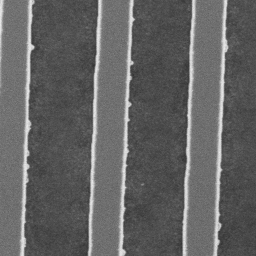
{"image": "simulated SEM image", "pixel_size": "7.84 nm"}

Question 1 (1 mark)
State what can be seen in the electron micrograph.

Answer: lines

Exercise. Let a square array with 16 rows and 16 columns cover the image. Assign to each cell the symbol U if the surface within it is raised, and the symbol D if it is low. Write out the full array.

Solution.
UUDDDDUUDDDDUUDD
UUDDDDUUDDDDUUDD
UUDDDDUUDDDDUUDD
UUDDDDUUDDDDUUDD
UUDDDDUUDDDDUUDD
UUDDDDUUDDDDUUDD
UUDDDDUUDDDDUUDD
UUDDDDUUDDDDUUDD
UUDDDDUUDDDDUUDD
UUDDDDUUDDDDUUDD
UUDDDDUUDDDDUUDD
UUDDDDUUDDDDUUDD
UUDDDDUUDDDDUUDD
UUDDDDUUDDDDUUDD
UDDDDDUUDDDUUUDD
UDDDDDUUDDDUUUDD